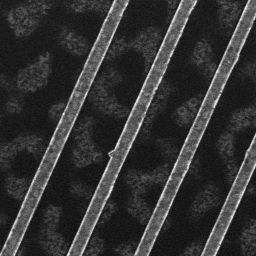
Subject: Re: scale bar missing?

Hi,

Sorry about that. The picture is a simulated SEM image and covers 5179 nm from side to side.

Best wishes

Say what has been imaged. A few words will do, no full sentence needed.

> one or a few lines or trenches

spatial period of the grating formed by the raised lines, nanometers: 1240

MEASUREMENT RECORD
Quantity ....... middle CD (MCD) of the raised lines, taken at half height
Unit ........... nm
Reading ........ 256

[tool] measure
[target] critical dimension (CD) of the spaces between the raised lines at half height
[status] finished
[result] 0.995 micrometres